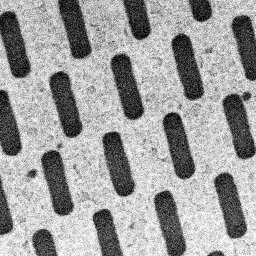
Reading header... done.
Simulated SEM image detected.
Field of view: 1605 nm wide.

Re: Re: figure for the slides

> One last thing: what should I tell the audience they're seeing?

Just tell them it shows holes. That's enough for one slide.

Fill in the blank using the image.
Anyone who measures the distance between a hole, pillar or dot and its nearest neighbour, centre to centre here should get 63.5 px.